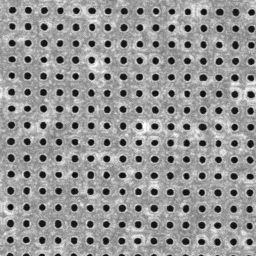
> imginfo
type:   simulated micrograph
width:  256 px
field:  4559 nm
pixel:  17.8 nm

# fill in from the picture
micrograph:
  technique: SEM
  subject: a regular array of holes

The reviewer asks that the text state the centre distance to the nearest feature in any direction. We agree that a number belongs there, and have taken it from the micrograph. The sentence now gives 282 nm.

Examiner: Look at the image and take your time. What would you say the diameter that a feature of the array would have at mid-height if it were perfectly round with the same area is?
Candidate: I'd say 0.13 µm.